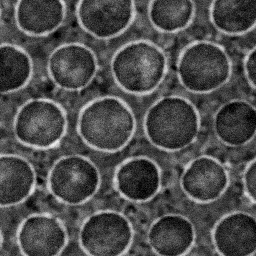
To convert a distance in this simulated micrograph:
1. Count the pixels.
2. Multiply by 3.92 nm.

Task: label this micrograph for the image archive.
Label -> a regular array of holes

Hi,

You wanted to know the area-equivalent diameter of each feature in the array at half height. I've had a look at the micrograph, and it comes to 194 nm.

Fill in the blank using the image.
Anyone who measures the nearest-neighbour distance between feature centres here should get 252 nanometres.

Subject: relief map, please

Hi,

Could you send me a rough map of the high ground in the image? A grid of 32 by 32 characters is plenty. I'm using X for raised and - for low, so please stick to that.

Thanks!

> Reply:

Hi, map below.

XX------XX-------XX-----XXX-----
XX------XX-------XX-----XX------
XX------XX-------XX-----XXX-----
XXX----XXXX-----XXXX---XXXX----X
XXXXXXXXXXXX--XXXXXXXXXXXXXXXXXX
XXXXXXXXXXXXXXXX---XXXXX--XXXXXX
---XXXX----XXXX-----XXX-----XXX-
----XX------XX-------XX------XX-
----XX------XX-------X-------XX-
----XXX-----XX------XX-------XX-
---XXXX----XXXX-----XXX-----XXXX
-XXXXXXXXXXXXXXXX--XXXXXX-XXXXXX
XXXX-XXXXXXX---XXXXX---XXXXXX-XX
XXX----XXXX-----XXX-----XXXX----
XX------XX-------X-------XX-----
XX------XX-------X-------XX-----
XX------XX-------X-------XX-----
XX-----XXXX-----XXX-----XXXX---X
XXXXXXXXXXXX---XXXXX---XXXXXXXXX
X-XXXXXXXXXXXXXXXXXXXXXXXXXXXXXX
----XXX-----XXX----XXXXX---XXXX-
----XX------XXX-----XXX-----XXX-
----XX------XX------XXX-----XXX-
----XX------XXX-----XXX-----XXX-
---XXXX----XXXXX---XXXXX---XXXX-
--XXXXXXXXXXXXXXXXXXXXXXXXXXXXXX
XXXXXXXXXXXXX-XXXXXXXXXXXXXXXXXX
XXX----XXXX-----XXXX---XXXXX----
XXX-----XX------XXX-----XXX-----
XX------XX------XXX-----XXX-----
XX------XX------XXX-----XXX-----
XXX-----XXX----XXXXX---XXXX-----